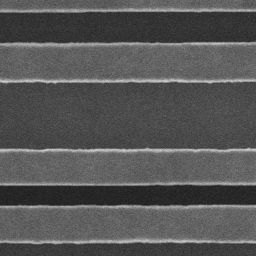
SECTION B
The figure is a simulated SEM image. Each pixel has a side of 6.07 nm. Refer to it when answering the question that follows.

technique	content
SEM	lines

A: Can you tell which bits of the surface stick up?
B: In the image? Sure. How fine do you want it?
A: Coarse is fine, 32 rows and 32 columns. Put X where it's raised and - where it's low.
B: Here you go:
XXXXXXXXXXXXXXXXXXXXXXXXXXXXXXXX
XXXXXXXXXXX---------------------
--------------------------------
--------------------------------
--------------------------------
XXXXXXXXXXXXXXXXXXXXXXXXXXXXXXXX
XXXXXXXXXXXXXXXXXXXXXXXXXXXXXXXX
XXXXXXXXXXXXXXXXXXXXXXXXXXXXXXXX
XXXXXXXXXXXXXXXXXXXXXXXXXXXXXXXX
XXXXXXXXXXXXXXXXXXXXXXXXXXXXXXXX
--------------------------------
--------------------------------
--------------------------------
--------------------------------
--------------------------------
--------------------------------
--------------------------------
--------------------------------
--------------------------------
XXXXXXXXXXXXXXXXXXXXXXXXXXXXXXXX
XXXXXXXXXXXXXXXXXXXXXXXXXXXXXXXX
XXXXXXXXXXXXXXXXXXXXXXXXXXXXXXXX
XXXXXXXXXXXXXXXXXXXXXXXXXXXXXXXX
--------------------------------
--------------------------------
--------------------------------
XXXXXXXXXXXXXXXXXXXXXXXXXXXXXXXX
XXXXXXXXXXXXXXXXXXXXXXXXXXXXXXXX
XXXXXXXXXXXXXXXXXXXXXXXXXXXXXXXX
XXXXXXXXXXXXXXXXXXXXXXXXXXXXXXXX
--------------------------------
--------------------------------